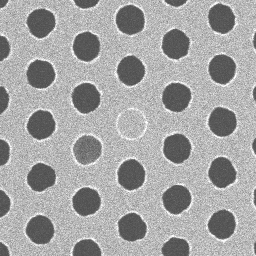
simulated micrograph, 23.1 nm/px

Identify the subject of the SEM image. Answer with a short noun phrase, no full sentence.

a regular array of holes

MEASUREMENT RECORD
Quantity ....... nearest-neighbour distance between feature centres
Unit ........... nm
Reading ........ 1170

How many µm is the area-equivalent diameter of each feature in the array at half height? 0.669